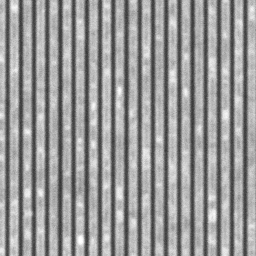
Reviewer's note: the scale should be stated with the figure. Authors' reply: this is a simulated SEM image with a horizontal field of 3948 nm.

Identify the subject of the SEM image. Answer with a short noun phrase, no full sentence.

parallel lines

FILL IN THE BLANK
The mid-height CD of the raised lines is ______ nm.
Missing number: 112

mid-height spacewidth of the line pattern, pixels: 5.5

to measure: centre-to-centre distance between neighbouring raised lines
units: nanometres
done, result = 203